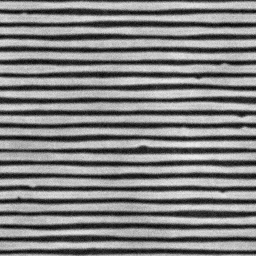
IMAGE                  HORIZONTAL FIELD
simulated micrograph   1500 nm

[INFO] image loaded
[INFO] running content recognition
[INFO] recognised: parallel lines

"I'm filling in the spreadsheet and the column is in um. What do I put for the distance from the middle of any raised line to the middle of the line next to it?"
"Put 0.0741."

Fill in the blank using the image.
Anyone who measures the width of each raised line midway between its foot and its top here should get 0.0374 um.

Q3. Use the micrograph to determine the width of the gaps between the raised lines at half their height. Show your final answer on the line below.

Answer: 37.4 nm